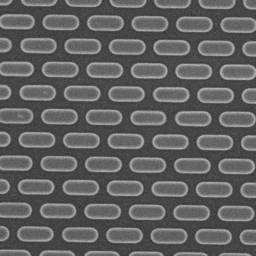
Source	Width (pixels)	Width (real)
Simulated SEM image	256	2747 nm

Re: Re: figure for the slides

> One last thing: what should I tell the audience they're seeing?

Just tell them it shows groups of lines, slits or small figures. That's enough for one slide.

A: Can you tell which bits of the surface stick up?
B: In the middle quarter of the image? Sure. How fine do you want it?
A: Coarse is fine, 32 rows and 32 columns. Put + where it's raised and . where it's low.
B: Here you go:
+++...++++++++...++++++++...++++
++++..+++++++++..+++++++++..++++
+++...++++++++...+++++++++..++++
.............................+++
................................
................................
+++++++++...++++++++...++++++++.
+++++++++..+++++++++..+++++++++.
.++++++++...++++++++...++++++++.
................................
................................
+...............................
+++...++++++++...++++++++...++++
+++...++++++++...++++++++...++++
+++...++++++++...++++++++...++++
................................
................................
.+++++++........................
+++++++++..+++++++++...++++++++.
+++++++++..+++++++++..+++++++++.
++++++++....++++++++...++++++++.
................................
................................
+++...+++++++.....+++...........
+++..+++++++++...++++++++...++++
+++..+++++++++...++++++++...++++
++....++++++++...++++++++...++++
................................
................................
.+++++++....++++++..............
+++++++++..+++++++++..+++++++++.
+++++++++..+++++++++..+++++++++.